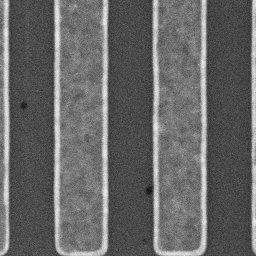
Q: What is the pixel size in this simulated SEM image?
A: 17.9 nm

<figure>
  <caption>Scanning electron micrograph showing wiring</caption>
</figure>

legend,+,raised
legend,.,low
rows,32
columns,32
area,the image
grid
+......++++++......++++++.......
+......++++++......++++++.......
+......++++++......++++++.......
+......++++++......++++++.......
+......++++++......++++++.......
+......++++++......++++++.......
+......++++++......++++++.......
+......++++++......++++++.......
+......++++++.......+++++.......
+......++++++.......+++++.......
+......++++++.......+++++.......
+......++++++.......+++++.......
+......++++++.......+++++.......
+......++++++.......+++++.......
+......++++++......++++++.......
+......++++++......++++++.......
+......++++++.......+++++.......
+......++++++.......+++++.......
+......++++++.......+++++.......
+......++++++.......+++++.......
+......++++++.......+++++.......
+......++++++.......+++++.......
+......++++++.......+++++.......
+......++++++.......+++++.......
+......++++++.......+++++.......
+......++++++.......+++++.......
+......++++++.......+++++.......
+......++++++.......+++++.......
+......++++++.......+++++.......
+......++++++.......+++++.......
+......++++++.......+++++.......
........+++++.......+++++.......